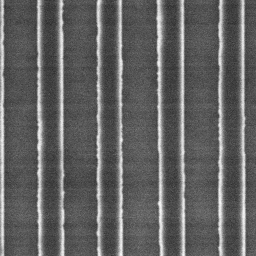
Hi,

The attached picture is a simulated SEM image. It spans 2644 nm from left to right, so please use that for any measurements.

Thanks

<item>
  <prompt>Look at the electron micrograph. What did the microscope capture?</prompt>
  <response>lines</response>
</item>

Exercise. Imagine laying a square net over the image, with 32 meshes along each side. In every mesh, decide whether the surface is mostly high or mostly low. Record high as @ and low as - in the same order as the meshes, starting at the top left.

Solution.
-----@@@----@@@-----@@@-----@@--
-----@@@----@@@-----@@@-----@@--
-----@@@----@@@-----@@@----@@@--
-----@@@----@@@-----@@@----@@@--
-----@@@----@@@-----@@@----@@@--
-----@@@----@@@-----@@@-----@@--
-----@@@----@@@-----@@@----@@@--
-----@@@----@@@-----@@@----@@@--
-----@@@----@@@-----@@@-----@@--
-----@@@----@@@-----@@@-----@@--
-----@@@----@@@-----@@@----@@@--
-----@@@----@@@-----@@@----@@@--
-----@@@----@@@-----@@@----@@@--
-----@@@----@@@-----@@@----@@@--
-----@@@----@@@-----@@@----@@@@-
-----@@@----@@@-----@@@----@@@@-
-----@@@----@@@-----@@@----@@@--
-----@@@----@@@-----@@@----@@@--
-----@@@----@@@-----@@@-----@@--
-----@@@----@@@-----@@@----@@@@-
-----@@@----@@@-----@@@----@@@@-
-----@@@----@@@-----@@@----@@@@-
-----@@@----@@@-----@@@----@@@@-
-----@@@----@@@-----@@@----@@@@-
-----@@@----@@@-----@@@----@@@@-
-----@@@----@@@-----@@@----@@@@-
-----@@@----@@@-----@@@----@@@@-
-----@@@----@@@-----@@@----@@@@-
-----@@@----@@@-----@@@----@@@@-
-----@@@----@@@-----@@@----@@@@-
-----@@@----@@@-----@@@----@@@@-
-----@@@----@@@-----@@@----@@@@-